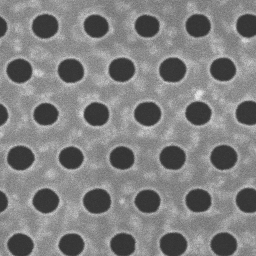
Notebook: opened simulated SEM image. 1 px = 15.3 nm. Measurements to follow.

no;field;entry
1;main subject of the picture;a regular array of holes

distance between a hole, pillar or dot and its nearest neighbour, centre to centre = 768 nm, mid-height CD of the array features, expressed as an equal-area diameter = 0.395 µm